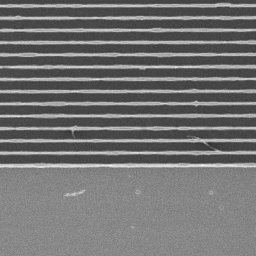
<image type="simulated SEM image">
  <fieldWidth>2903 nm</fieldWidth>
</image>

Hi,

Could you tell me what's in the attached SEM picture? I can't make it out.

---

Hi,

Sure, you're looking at parallel lines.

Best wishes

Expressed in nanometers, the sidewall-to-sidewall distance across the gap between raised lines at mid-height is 99.3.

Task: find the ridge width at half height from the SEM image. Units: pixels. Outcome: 3.5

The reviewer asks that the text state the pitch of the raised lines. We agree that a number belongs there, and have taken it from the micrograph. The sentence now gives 0.139 µm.